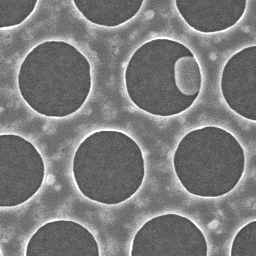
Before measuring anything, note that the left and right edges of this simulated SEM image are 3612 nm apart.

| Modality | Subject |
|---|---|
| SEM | holes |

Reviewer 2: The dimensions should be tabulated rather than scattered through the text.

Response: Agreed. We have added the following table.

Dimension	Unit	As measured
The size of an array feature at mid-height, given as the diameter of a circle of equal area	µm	1.04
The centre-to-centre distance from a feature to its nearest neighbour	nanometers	1390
